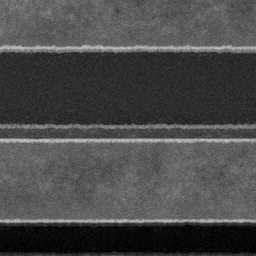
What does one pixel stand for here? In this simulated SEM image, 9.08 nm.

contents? lines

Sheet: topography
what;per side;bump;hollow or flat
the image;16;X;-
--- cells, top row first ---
XXXXXXXXXXXXXXXX
XXXXXXXXXXXXXXXX
XXXXXXXXXXXXXXXX
----------------
----------------
----------------
----------------
----------------
----------------
XXXXXXXXXXXXXXXX
XXXXXXXXXXXXXXXX
XXXXXXXXXXXXXXXX
XXXXXXXXXXXXXXXX
XXXXXXXXXXXXXXXX
----------------
----------------